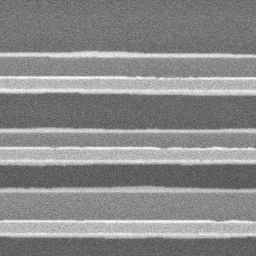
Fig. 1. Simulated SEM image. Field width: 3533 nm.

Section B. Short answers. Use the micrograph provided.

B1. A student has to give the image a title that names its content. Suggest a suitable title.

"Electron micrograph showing lines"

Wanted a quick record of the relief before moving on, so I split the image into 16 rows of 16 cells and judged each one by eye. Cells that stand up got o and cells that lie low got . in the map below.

................
................
................
oooooooo........
oooooooooooooooo
oooooooooooooooo
................
................
oooooooooooooooo
oooooooooooooooo
................
................
oooooooooooooooo
oooooooooooooooo
oooooooooooooooo
................